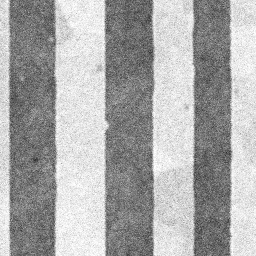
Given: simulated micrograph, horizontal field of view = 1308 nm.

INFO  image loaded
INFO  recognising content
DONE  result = one or a few lines or trenches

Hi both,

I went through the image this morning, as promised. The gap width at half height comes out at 244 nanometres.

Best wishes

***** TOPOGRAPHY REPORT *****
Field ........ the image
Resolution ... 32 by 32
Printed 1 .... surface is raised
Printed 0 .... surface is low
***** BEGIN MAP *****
10000001111110000001111100000111
10000001111110000001111100000111
10000001111110000001111100000111
10000001111110000001111100000111
10000001111110000001111100000111
10000001111110000001111100000111
10000001111110000001111100000111
10000001111110000001111100000111
10000001111110000001111100000111
10000001111110000001111100000111
10000001111110000001111100000111
10000001111110000001111100000111
10000001111110000001111100000111
10000001111110000001111100000111
10000001111110000001111100000111
10000001111110000001111100000111
10000001111110000001111100000111
10000001111110000001111100000111
10000001111110000001111100000111
10000001111110000001111100000111
10000001111110000001111100000111
10000001111110000001111100000111
10000001111110000001111100000111
10000001111110000001111100000111
10000001111110000001111100000111
10000001111110000001111100000111
10000001111110000001111100000111
10000001111110000001111100000111
10000001111110000001111100000111
10000001111110000001111100000111
10000001111110000001111100000111
10000001111110000001111100000111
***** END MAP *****